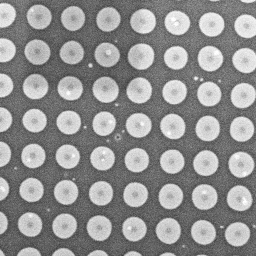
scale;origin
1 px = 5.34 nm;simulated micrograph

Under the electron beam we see an array of small figures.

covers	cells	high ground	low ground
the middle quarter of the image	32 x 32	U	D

DDDDDDDDDDUUDDDDDUUUUDDDDDUUUUDD
DDDDDDDDDDDDDDDDDDDDDDDDDDDDDDDD
DDDDDDDDDDDDDDDDDDDDDDDDDDDDDDDD
UUUDDDDDDUUDDDDDDDDDDDDDDDDDDDDD
UUUUDDDDUUUUUDDDDUUUUDDDDDUUUDDD
UUUUDDDUUUUUUDDDUUUUUUDDDUUUUUDD
UUUUUDDUUUUUUUDDUUUUUUDDDUUUUUUD
UUUUDDDDUUUUUDDDUUUUUUDDDUUUUUDD
UUUDDDDDUUUUUDDDUUUUUDDDDUUUUUDD
DDDDDDDDDDDDDDDDDDUUDDDDDDUUUDDD
DDDDDDDDDDDDDDDDDDDDDDDDDDDDDDDD
DDDDDDDDDDDDDDDDDDDDDDDDDDDDDDDD
UUUDDDDDDUUUDDDDDDUDDDDDDDDDDDDD
UUUUDDDDUUUUUDDDUUUUUDDDDUUUUDDD
UUUUDDDUUUUUUDDDUUUUUUDDUUUUUUDD
UUUUDDDUUUUUUDDDUUUUUUDDUUUUUUDD
UUUDDDDDUUUUDDDDUUUUUUDDUUUUUUDD
DDDDDDDDDUUDDDDDDUUUUDDDDUUUUUDD
DDDDDDDDDDDDDDDDDDDDDDDDDDUUUDDD
DDDDDDDDDDDDDDDDDDDDDDDDDDDDDDDD
UUDDDDDDDDDDDDDDDDDDDDDDDDDDDDDD
UUUDDDDDUUUUDDDDDUUUDDDDDDDDDDDD
UUUUDDDUUUUUDDDDUUUUUDDDDUUUUDDD
UUUUDDDUUUUUDDDUUUUUUDDDUUUUUUDD
UUUUDDDUUUUUDDDUUUUUUDDDUUUUUUDD
UUUDDDDUUUUUDDDDUUUUUDDDUUUUUUDD
DDDDDDDDDDDDDDDDUUUUDDDDDUUUUDDD
DDDDDDDDDDDDDDDDDDDDDDDDDDDDDDDD
DDDDDDDDDDDDDDDDDDDDDDDDDDDDDDDD
UUDDDDDDDUDDDDDDDDDDDDDDDDDDDDDD
UUUDDDDUUUUUDDDDUUUUDDDDDUUUDDDD
UUUDDDUUUUUUDDDUUUUUUDDDUUUUUDDD